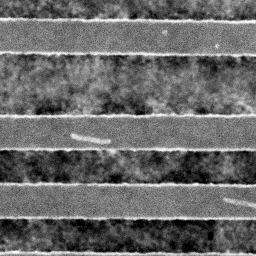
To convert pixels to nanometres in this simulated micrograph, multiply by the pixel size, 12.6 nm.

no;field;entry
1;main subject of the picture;lines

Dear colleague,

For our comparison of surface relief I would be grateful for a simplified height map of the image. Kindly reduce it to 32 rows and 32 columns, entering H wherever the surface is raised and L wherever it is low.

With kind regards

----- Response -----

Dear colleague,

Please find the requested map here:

LLLLLLLLLLLLLLLLLLLLLLLLLLLLLLLL
LLLLLLLLLLLLLLLLLLLLLLLLLLLLLLLL
HHHHHHHHHHHHHHHHLHHLLLLLLLLLLLLL
HHHHHHHHHHHHHHHHHHHHHHHHHHHHHHHH
HHHHHHHHHHHHHHHHHHHHHHHHHHHHHHHH
HHHHHHHHHHHHHHHHHHHHHHHHHHHHHHHH
HHHHHHHHHHHHHHHHHHHHHHHHHHHHHHHH
LLLLLLLLLLLLLLLLLLLLLLLLLLLLLLLL
LLLLLLLLLLLLLLLLLLLLLLLLLLLLLLLL
LLLLLLLLLLLLLLLLLLLLLLLLLLLLLLLL
LLLLLLLLLLLLLLLLLLLLLLLLLLLLLLLL
LLLLLLLLLLLLLLLLLLLLLLLLLLLLLLLL
LLLLLLLLLLLLLLLLLLLLLLLLLLLLLLLL
LLLLLLLLLLLLLLLLLLLLLLLLLLLLLLLL
HHHHHHHHHLHHHHHHHHHHHHHHHHHHHHHH
HHHHHHHHHHHHHHHHHHHHHHHHHHHHHHHH
HHHHHHHHHHHHHHHHHHHHHHHHHHHHHHHH
HHHHHHHHHHHHHHHHHHHHHHHHHHHHHHHH
HHHHHHHHHHHHHHHHHHHHHHHHHHHHHHHH
LLLLLLLLLLLLLLLLLLLLLLLLLLLLLLLL
LLLLLLLLLLLLLLLLLLLLLLLLLLLLLLLL
LLLLLLLLLLLLLLLLLLLLLLLLLLLLLLLL
LLLLLLLLLLLLLLLLLLLLLLLLLLLLLLLL
HHHHHHHHHHHHHHHHHHHHHHHHHHHHHHHH
HHHHHHHHHHHHHHHHHHHHHHHHHHHHHHHH
HHHHHHHHHHHHHHHHHHHHHHHHHHHHHHHH
HHHHHHHHHHHHHHHHHHHHHHHHHHHHHHHH
LLLLLLLLLLLLLLLLLLLLLLLLLLLLLLLL
LLLLLLLLLLLLLLLLLLLLLLLLLLLLLLLL
LLLLLLLLLLLLLLLLLLLLLLLLLLLLLLLL
LLLLLLLLLLLLLLLLLLLLLLLLLLLLLLLL
LLLLLLLLLLLLLLLLLLLLLLLLLLLLLLLL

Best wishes